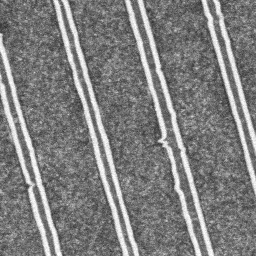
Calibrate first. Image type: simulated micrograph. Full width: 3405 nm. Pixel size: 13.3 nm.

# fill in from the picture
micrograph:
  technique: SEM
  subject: one or a few lines or trenches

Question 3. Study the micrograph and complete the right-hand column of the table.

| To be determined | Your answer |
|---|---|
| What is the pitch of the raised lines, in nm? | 964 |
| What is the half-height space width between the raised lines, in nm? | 804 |